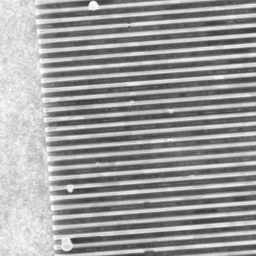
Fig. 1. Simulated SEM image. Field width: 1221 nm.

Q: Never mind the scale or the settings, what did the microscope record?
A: parallel lines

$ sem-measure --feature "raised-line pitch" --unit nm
46.9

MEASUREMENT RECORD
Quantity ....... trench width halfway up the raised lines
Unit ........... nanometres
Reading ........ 28.5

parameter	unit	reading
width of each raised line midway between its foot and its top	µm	0.0166